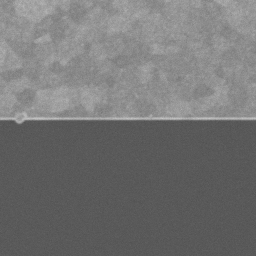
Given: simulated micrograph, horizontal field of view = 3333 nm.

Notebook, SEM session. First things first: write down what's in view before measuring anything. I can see wiring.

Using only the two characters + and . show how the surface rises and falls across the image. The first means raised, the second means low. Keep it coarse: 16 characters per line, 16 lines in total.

++++++++++++++++
++++++++++++++++
++++++++++++++++
++++++++++++++++
++++++++++++++++
++++++++++++++++
++++++++++++++++
.+..............
................
................
................
................
................
................
................
................